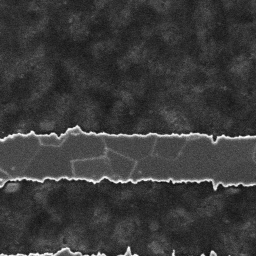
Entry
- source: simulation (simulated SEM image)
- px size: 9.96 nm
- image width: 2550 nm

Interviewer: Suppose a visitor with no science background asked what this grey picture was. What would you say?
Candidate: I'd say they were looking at one or a few lines or trenches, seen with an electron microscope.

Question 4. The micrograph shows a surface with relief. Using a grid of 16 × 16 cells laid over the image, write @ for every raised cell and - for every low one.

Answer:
----------------
----------------
----------------
----------------
----------------
----------------
----------------
----------------
-@@@@@@@@@@@@---
@@@@@@@@@@@@@@@@
@@@@@@@@@@@@@@@@
@------------@@@
----------------
----------------
----------------
----------------